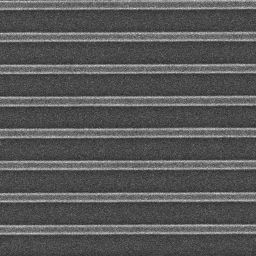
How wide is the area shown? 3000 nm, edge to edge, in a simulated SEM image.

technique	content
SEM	parallel lines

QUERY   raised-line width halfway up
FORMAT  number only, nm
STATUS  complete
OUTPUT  90.8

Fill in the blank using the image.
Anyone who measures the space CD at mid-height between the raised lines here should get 0.281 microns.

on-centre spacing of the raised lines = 376 nm